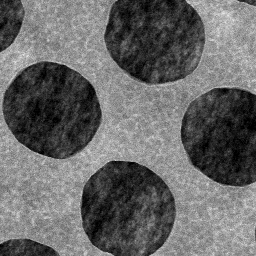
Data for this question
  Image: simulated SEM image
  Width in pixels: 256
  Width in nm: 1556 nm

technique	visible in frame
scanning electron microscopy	holes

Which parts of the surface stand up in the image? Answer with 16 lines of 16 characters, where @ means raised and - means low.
-@@@@@@-----@@@@
-@@@@@@------@@@
-@@@@@@------@@@
@@@@@@@------@@@
@----@@@----@@@@
@-----@@@@@@@@@@
------@@@@@@----
------@@@@@-----
@-----@@@@@-----
@@---@@@@@@@----
@@@@@@---@@@----
@@@@@-----@@@@--
@@@@@------@@@@@
@@@@@------@@@@@
@@@@@------@@@@@
---@@@----@@@@@@